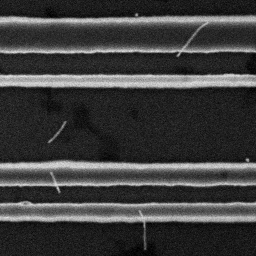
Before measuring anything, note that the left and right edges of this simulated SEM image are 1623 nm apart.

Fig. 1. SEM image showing lines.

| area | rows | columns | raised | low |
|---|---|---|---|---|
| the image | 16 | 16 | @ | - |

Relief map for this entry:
----------------
@@@@@@@@@@@@@@@@
@@@@@@@@@@@@@@@@
@@@@@@@@@@@@@@@@
@@@@@@@@@@@@@@@@
----------------
----------------
----------------
----------------
----------------
@@@@@@@@@@@@@@@@
@@@@@@@@@@@@@@@@
@@@@@@@@@@@@@@@@
@@@@@@@@@@@@@@@@
----------------
----------------